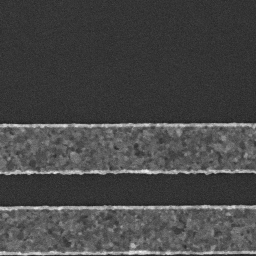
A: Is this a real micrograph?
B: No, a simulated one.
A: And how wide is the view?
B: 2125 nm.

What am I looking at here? one or a few lines or trenches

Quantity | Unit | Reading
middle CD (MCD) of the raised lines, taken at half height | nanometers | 395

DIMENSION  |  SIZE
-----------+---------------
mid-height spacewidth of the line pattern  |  34.6 px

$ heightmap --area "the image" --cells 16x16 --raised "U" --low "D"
DDDDDDDDDDDDDDDD
DDDDDDDDDDDDDDDD
DDDDDDDDDDDDDDDD
DDDDDDDDDDDDDDDD
DDDDDDDDDDDDDDDD
DDDDDDDDDDDDDDDD
DDDDDDDDDDDDDDDD
DDDDDDDDDDDDDDDD
UUUUUUUUUUUUUUUU
UUUUUUUUUUUUUUUU
UUUUUUUUUUUUUUUU
DDDDDDDDDDDDDDDD
DDDDDDDDDDDDDDDD
UUUUUUUUUUUUUUUU
UUUUUUUUUUUUUUUU
UUUUUUUUUUUUUUUU